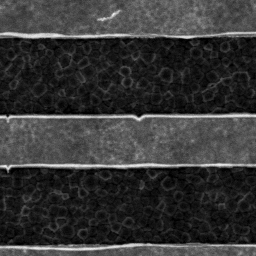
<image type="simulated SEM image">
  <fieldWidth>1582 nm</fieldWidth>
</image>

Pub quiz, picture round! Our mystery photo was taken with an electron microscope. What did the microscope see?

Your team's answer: one or a few lines or trenches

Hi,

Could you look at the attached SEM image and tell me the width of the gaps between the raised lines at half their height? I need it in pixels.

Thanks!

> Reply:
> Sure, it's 80.4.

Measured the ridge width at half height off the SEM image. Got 300 nm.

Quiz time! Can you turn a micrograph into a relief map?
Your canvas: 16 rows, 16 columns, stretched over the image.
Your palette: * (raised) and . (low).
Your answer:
****************
****************
................
................
................
................
................
****************
****************
****************
................
................
................
................
................
**.....*********